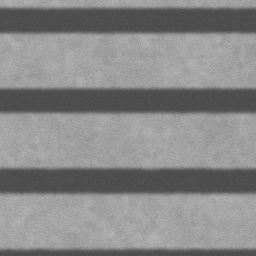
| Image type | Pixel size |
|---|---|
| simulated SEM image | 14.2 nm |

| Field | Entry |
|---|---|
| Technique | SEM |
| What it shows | lines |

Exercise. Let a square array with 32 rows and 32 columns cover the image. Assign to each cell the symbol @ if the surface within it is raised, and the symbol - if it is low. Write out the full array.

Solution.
@@@@@@@@@@@@@@@@@@@@@@@@@@@@@@@@
--------------------------------
--------------------------------
--------------------------------
@@@@@@@@@@@@@@@@@@@@@@@@@@@@@@@@
@@@@@@@@@@@@@@@@@@@@@@@@@@@@@@@@
@@@@@@@@@@@@@@@@@@@@@@@@@@@@@@@@
@@@@@@@@@@@@@@@@@@@@@@@@@@@@@@@@
@@@@@@@@@@@@@@@@@@@@@@@@@@@@@@@@
@@@@@@@@@@@@@@@@@@@@@@@@@@@@@@@@
@@@@@@@@@@@@@@@@@@@@@@@@@@@@@@@@
--------------------------------
--------------------------------
--------------------------------
@@@@@@@@@@@@@@@@@@@@@@@@@@@@@@@@
@@@@@@@@@@@@@@@@@@@@@@@@@@@@@@@@
@@@@@@@@@@@@@@@@@@@@@@@@@@@@@@@@
@@@@@@@@@@@@@@@@@@@@@@@@@@@@@@@@
@@@@@@@@@@@@@@@@@@@@@@@@@@@@@@@@
@@@@@@@@@@@@@@@@@@@@@@@@@@@@@@@@
@@@@@@@@@@@@@@@@@@@@@@@@@@@@@@@@
--------------------------------
--------------------------------
--------------------------------
@@@@@@@@@@@@@@@@@@@@@@@@@@@@@@@@
@@@@@@@@@@@@@@@@@@@@@@@@@@@@@@@@
@@@@@@@@@@@@@@@@@@@@@@@@@@@@@@@@
@@@@@@@@@@@@@@@@@@@@@@@@@@@@@@@@
@@@@@@@@@@@@@@@@@@@@@@@@@@@@@@@@
@@@@@@@@@@@@@@@@@@@@@@@@@@@@@@@@
@@@@@@@@@@@@@@@@@@@@@@@@@@@@@@@@
--------------------------------